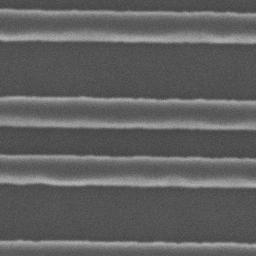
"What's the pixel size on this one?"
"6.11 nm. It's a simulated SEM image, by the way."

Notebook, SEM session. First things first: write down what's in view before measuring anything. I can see lines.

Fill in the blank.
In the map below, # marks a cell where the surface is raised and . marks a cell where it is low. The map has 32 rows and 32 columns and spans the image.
................................
###############.................
################################
################################
################################
................................
................................
................................
................................
................................
................................
................................
####################.##.##......
################################
################################
....############################
................................
................................
................................
##########.#....................
################################
################################
.###############################
................................
................................
................................
................................
................................
................................
................................
##############################..
################################